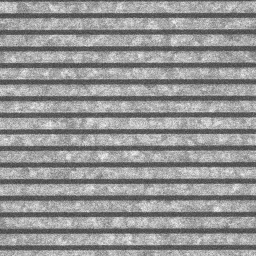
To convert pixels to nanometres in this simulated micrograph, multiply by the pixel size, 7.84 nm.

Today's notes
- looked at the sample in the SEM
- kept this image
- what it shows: parallel lines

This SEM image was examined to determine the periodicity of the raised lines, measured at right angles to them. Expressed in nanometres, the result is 130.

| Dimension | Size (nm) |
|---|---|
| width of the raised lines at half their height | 86.2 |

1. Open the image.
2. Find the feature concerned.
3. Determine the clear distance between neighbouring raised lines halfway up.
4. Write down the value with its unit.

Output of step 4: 43.1 nm